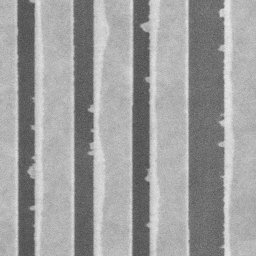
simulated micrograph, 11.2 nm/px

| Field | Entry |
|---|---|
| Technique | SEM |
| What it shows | lines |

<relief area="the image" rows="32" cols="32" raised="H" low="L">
HHLLLHHHHLLLHHHHLLLHHHHLLLLLHHHH
HHLLLHHHHLLLHHHHLLLHHHHLLLLLHHHH
HHLLLHHHHLLLHHHHLLLHHHHLLLLLHHHH
HHLLLHHHHLLLHHHHLLLHHHHLLLLLHHHH
HHLLLHHHHLLLHHHHLLLHHHHLLLLLHHHH
HHLLLHHHHLLLHHHHLLLHHHHLLLLLHHHH
HHLLLHHHHLLLHHHHLLLHHHHLLLLLHHHH
HHLLLHHHHLLLHHHHLLLHHHHLLLLLHHHH
HHLLLHHHHLLLHHHHLLLHHHHLLLLLHHHH
HHLLLHHHHLLLHHHHLLLHHHHLLLLLHHHH
HHLLLHHHHLLLHHHHLLLHHHHLLLLLHHHH
HHLLLHHHHLLLHHHHLLLHHHHLLLLLHHHH
HHLLLHHHHLLLHHHHLLLHHHHLLLLLHHHH
HHLLLHHHHLLLHHHHLLLHHHHLLLLLHHHH
HHLLLHHHHLLLHHHHLLLHHHHLLLLLHHHH
HHLLLHHHHLLLHHHHLLLHHHHLLLLLHHHH
HHLLLHHHHLLLHHHHLLLHHHHLLLLLHHHH
HHLLLHHHHLLLHHHHLLLHHHHLLLLLHHHH
HHLLLHHHHLLLHHHHLLLHHHHLLLLLHHHH
HHLLLHHHHLLLHHHHLLLHHHHLLLLLHHHH
HHLLLHHHHLLLHHHHLLLHHHHLLLLLHHHH
HHLLLHHHHLLLHHHHLLLHHHHLLLLLHHHH
HHLLLHHHHLLLHHHHLLLHHHHLLLLLHHHH
HHLLLHHHHLLLHHHHLLLHHHHLLLLLHHHH
HHLLLHHHHLLLHHHHLLLHHHHLLLLLHHHH
HHLLLHHHHLLLHHHHLLLHHHHLLLLLHHHH
HHLLLHHHHLLLHHHHLLLHHHHLLLLLHHHH
HHLLLHHHHLLLHHHHLLLHHHHLLLLLHHHH
HHLLLHHHHLLLHHHHLLLHHHHLLLLLHHHH
HHLLLHHHHLLLHHHHLLLHHHHLLLLLHHHH
HHLLLHHHHLLLHHHHLLLHHHHLLLLLHHHH
HHLLLHHHHLLLHHHHLLLHHHHLLLLLHHHH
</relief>